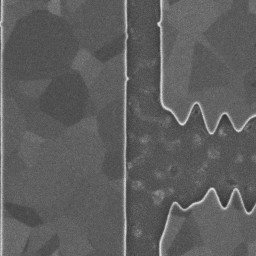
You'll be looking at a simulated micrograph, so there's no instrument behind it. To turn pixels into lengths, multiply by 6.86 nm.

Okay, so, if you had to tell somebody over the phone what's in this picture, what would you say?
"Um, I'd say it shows one or a few lines or trenches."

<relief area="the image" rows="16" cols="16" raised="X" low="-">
XXXXXXXX--XXXXXX
XXXXXXXX--XXXXXX
XXXXXXXX--XXXXXX
XXXXXXXX--XXXXXX
XXXXXXXX--XXXXXX
XXXXXXXX--XXXXXX
XXXXXXXX--XXXXXX
XXXXXXXX-----XXX
XXXXXXXX--------
XXXXXXXX--------
XXXXXXXX--------
XXXXXXXX--------
XXXXXXXX-----XX-
XXXXXXXX---XXXXX
XXXXXXXX--XXXXXX
XXXXXXXX--XXXXXX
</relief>